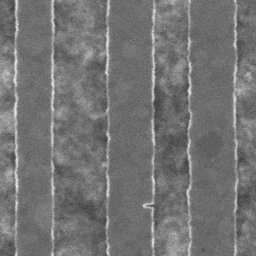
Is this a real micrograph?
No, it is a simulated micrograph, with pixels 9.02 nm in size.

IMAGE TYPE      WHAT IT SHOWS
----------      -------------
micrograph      one or a few lines or trenches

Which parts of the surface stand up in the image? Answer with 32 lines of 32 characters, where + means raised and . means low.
..+++++......++++++.....++++++..
..+++++......++++++.....++++++..
..+++++......++++++.....+++++...
..+++++......++++++.....+++++...
..+++++......++++++.....+++++...
..+++++...+..++++++.....+++++...
..+++++....+.++++++.....++++++..
..+++++......++++++.....++++++..
..+++++......++++++.....++++++..
..+++++......++++++.....+++++...
..+++++......++++++.....+++++...
..+++++......++++++.....+++++...
..+++++......++++++.....+++++...
..+++++......++++++.....+++++...
..+++++......++++++.....+++++...
..+++++.......+++++.....+++++.++
..+++++......++++++....++++++..+
..+++++......++++++.....++++++..
..+++++......++++++....+++++++..
..++++.......++++++....+++++++..
..+++++......++++++.....++++++..
..+++++......++++++.....++++++..
..+++++......++++++.....++++++..
..+++++......++++++.....++++++..
..+++++......++++++....+++++++..
..+++++......++++++.....++++++..
..+++++......++++++.....+++++...
..+++++......++++++.....+++++...
..+++++......++++++.....+++++.+.
..+++++......++++++.....+++++...
..+++++......++++++.....+++++...
..+++++......++++++.....+++++...